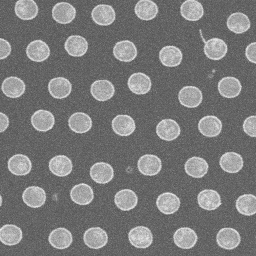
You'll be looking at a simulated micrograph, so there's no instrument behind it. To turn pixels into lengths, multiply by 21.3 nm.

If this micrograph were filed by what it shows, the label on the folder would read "a regular array of raised bodies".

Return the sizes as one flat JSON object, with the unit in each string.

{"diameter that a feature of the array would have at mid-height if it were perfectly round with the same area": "454 nm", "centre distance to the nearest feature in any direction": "762 nanometres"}